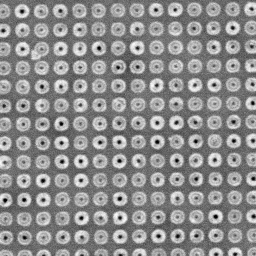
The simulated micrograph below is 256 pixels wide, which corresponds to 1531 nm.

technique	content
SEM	a regular array of ring-shaped raised bodies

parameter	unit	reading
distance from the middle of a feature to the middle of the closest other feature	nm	112